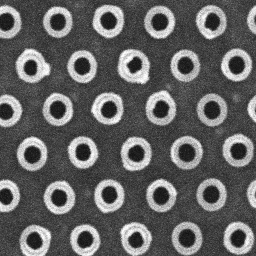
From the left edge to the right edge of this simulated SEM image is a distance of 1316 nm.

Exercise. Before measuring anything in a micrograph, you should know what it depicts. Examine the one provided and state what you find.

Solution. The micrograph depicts a regular array of ring-shaped raised bodies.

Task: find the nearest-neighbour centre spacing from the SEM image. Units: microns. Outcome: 0.253